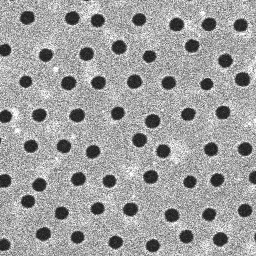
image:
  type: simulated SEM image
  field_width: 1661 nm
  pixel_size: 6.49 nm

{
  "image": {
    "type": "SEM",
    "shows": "a regular array of holes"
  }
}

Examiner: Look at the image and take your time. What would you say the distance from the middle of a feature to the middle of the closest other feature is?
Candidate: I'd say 192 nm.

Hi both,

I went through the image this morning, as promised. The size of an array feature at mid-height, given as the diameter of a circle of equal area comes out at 89.7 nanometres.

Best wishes